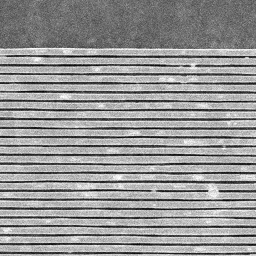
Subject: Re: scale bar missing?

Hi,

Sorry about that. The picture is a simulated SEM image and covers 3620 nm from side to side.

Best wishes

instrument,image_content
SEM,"parallel lines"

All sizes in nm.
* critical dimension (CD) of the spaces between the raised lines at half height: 37.1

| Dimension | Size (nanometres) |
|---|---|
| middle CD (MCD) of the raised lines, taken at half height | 88.4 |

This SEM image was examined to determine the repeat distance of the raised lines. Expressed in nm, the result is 126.